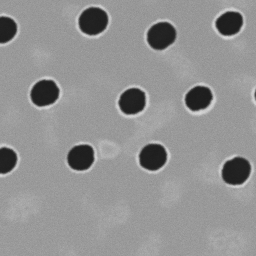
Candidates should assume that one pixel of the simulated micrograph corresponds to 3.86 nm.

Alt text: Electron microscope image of a regular array of holes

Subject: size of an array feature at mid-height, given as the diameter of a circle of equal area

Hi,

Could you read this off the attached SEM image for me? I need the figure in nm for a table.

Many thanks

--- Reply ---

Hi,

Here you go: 106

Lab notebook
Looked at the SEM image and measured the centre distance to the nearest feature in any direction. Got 69.4 px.